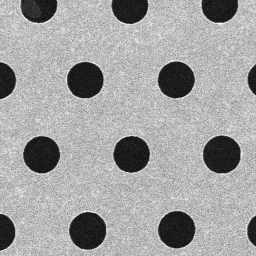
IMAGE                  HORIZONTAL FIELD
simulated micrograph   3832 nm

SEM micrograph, holes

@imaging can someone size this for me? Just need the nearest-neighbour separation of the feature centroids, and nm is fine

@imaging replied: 1300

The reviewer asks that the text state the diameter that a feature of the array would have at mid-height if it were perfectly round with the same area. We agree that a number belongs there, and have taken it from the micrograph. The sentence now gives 557 nm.